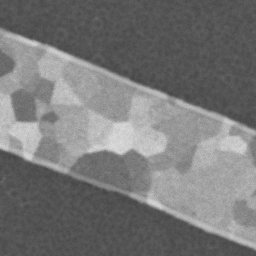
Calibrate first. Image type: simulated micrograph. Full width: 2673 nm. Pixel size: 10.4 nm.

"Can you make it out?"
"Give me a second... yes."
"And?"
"one or a few lines or trenches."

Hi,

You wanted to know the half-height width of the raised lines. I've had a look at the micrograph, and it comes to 1110 nm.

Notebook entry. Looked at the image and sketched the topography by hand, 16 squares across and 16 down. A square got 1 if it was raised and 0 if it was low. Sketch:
0000000000000000
0000000000000000
1000000000000000
1111000000000000
1111111000000000
1111111110000000
1111111111100000
1111111111111100
1111111111111111
0111111111111111
0000111111111111
0000001111111111
0000000001111111
0000000000011111
0000000000000011
0000000000000000